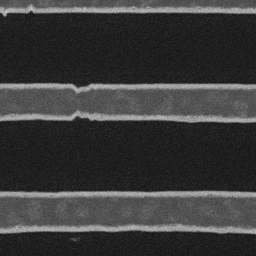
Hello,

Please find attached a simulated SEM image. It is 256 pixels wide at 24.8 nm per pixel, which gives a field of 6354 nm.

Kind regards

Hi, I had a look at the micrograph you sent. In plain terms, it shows one or a few lines or trenches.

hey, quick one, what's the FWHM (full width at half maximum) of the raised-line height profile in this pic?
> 844 nanometers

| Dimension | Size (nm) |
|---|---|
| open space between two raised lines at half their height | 1890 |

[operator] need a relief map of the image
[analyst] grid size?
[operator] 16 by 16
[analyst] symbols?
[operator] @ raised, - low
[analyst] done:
@@@@@@@@@@@@@@@@
----------------
----------------
----------------
----------------
@@@@@@@@@@@@@@@@
@@@@@@@@@@@@@@@@
--------------@@
----------------
----------------
----------------
----------------
@@@@@@@@@@@@@@@@
@@@@@@@@@@@@@@@@
----------------
----------------